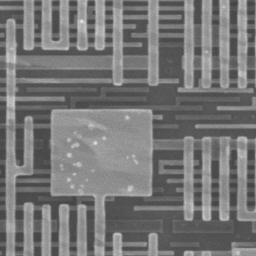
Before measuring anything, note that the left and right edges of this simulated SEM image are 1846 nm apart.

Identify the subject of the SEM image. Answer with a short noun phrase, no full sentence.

wiring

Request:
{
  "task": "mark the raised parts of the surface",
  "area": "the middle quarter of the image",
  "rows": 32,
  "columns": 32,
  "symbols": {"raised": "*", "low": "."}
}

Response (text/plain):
............***......**.......**
............***......**.......**
............***......**.......**
............***......**.......**
............***......**.......**
..............................**
................................
................................
................................
................................
................................
*********************...........
**********************..........
**********************..........
**********************..........
**********************..........
**********************..........
**********************..........
**********************........**
**********************........**
**********************........**
**********************........**
**********************........**
**********************........**
**********************........**
**********************........**
**********************........**
**********************........**
**********************........**
**********************........**
**********************........**
**********************........**